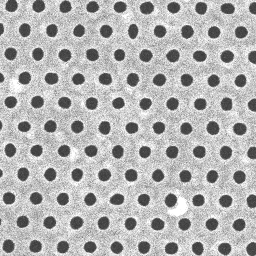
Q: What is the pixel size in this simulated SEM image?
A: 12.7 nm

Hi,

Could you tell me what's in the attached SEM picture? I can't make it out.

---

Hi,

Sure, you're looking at a regular array of holes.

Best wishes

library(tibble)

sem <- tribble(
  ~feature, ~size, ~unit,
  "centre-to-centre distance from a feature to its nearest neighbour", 26.7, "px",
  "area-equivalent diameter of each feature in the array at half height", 0.162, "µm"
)